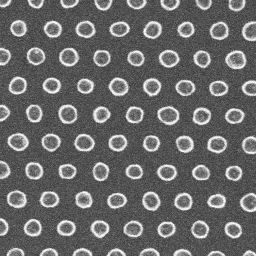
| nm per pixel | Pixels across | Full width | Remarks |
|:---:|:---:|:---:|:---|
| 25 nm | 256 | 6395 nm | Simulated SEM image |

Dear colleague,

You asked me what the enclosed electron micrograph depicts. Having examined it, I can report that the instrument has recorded a regular array of raised bodies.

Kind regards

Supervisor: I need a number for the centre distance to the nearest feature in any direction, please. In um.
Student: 0.814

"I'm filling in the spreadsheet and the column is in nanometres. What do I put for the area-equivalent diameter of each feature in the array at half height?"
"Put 404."